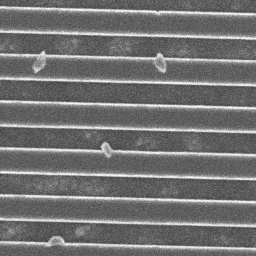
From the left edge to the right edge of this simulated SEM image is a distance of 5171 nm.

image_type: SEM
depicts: parallel lines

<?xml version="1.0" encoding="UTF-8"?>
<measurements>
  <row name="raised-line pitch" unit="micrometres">0.948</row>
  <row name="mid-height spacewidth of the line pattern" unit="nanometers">442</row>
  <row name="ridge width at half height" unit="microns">0.497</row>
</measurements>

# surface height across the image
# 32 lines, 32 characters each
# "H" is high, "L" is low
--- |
LLLLLLLLLLLLLLLLLLLLLLLLLLLLLLLL
HHHHHHHHHHHHHHHHHHHLLLLLLLLLLLLL
HHHHHHHHHHHHHHHHHHHHHHHHHHHHHHHH
HHHHHHHHHHHHHHHHHHHHHHHHHHHHHHHH
LLLLLLLLLLLLLLLLLLLLHHHHHHHHHHHH
LLLLLLLLLLLLLLLLLLLLLLLLLLLLLLLL
LLLLLLLLLLLLLLLLLLLLLLLLLLLLLLLL
HHHHHHHHHHHHHHHHHHHHHHHHHHHLLLLL
HHHHHHHHHHHHHHHHHHHHHHHHHHHHHHHH
HHHHHHHHHHHHHHHHHHHHHHHHHHHHHHHH
LLLLLLLLLLLLLLLLLLLLLLLLLLHHHHHH
LLLLLLLLLLLLLLLLLLLLLLLLLLLLLLLL
LLLLLLLLLLLLLLLLLLLLLLLLLLLLLLLL
HHHHHHHHHHHHHHHHHHHHHHHHHHHHHLLL
HHHHHHHHHHHHHHHHHHHHHHHHHHHHHHHH
HHHHHHHHHHHHHHHHHHHHHHHHHHHHHHHH
LLLLLLLLLLLLLLLLLLLLLLLLLLLLLLHH
LLLLLLLLLLLLLLLLLLLLLLLLLLLLLLLL
LLLLLLLLLLLLLHLLLLLLLLLLLLLLLLLL
HHHHHHHHHHHHHHHHHHHHHHHHHHHHHHHH
HHHHHHHHHHHHHHHHHHHHHHHHHHHHHHHH
HHHHHHHHHHHHHHHHHHHHHHHHHHHHHHHH
LLLLLLLLLLLLLLLLLLLLLLLLLLLLLLLL
LLLLLLLLLLLLLLLLLLLLLLLLLLLLLLLL
HHLLLLLLLLLLLLLLLLLLLLLLLLLLLLLL
HHHHHHHHHHHHHHHHHHHHHHHHHHHHHHHH
HHHHHHHHHHHHHHHHHHHHHHHHHHHHHHHH
LLLHHHHHHHHHHHHHHHHHHHHHHHHHHHHH
LLLLLLLLLLLLLLLLLLLLLLLLLLLLLLLL
LLLLLLLLLLLLLLLLLLLLLLLLLLLLLLLL
HHHHHHHHHLLLLLLLLLLLLLLLLLLLLLLL
HHHHHHHHHHHHHHHHHHHHHHHHHHHHHHHH